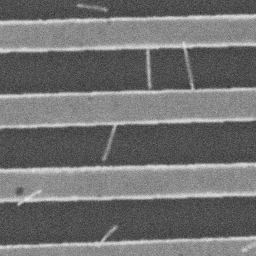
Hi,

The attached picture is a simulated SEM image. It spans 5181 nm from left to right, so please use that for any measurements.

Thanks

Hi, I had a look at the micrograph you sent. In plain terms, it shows lines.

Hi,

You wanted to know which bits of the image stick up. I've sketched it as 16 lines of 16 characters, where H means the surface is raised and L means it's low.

LLLLLLLLLLLLLLLL
HHHHHHHHHHHHHHHH
HHHHHHHHHHHHHHHH
LLLLLLLLLLLLLLLL
LLLLLLLLLLLLLLLL
LLLLLLLLLLLLLLLL
HHHHHHHHHHHHHHHH
HHHHHHHHHHHHHHHL
LLLLLLLLLLLLLLLL
LLLLLLLLLLLLLLLL
LLLLLLHHHHHHHHHH
HHHHHHHHHHHHHHHH
HHHHLLLLLLLLLLLL
LLLLLLLLLLLLLLLL
LLLLLLLLLLLLLLLL
HHHHHHHHHHHHHHHH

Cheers